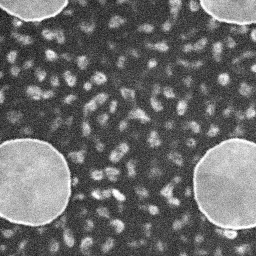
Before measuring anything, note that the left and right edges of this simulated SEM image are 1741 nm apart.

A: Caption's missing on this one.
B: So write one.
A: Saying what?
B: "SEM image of raised bodies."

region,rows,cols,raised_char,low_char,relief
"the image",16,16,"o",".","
oooo.........ooo
................
................
................
................
................
................
................
................
oooo.........ooo
oooo........oooo
oooo........oooo
oooo........oooo
oooo.........ooo
................
................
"